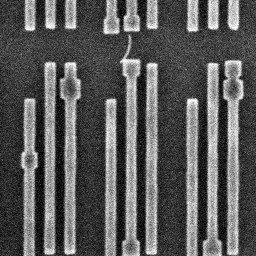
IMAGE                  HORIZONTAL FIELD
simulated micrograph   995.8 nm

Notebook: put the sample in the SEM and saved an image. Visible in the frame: wiring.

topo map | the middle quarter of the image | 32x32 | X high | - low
XXX------------XXXX--XX---------
XXX------------XXXX--XX---------
XXX------------XXXX--XX---------
XXX-------------XX---XX---------
XXXX------------XX---XX---------
XXXX------------XX---XX---------
XXXX------------XX---XX---------
XXXX------------XX---XX---------
XXX-------------XX---XX---------
-XX--------XX---XX---XX--------X
-XX--------XX---XX---XX--------X
-XX--------XX---XX---XX--------X
-XX--------XX---XX---XX--------X
-XX--------XX---XX---XX--------X
-XX--------XX---XX---XX--------X
-XX--------XX---XX---XX--------X
-XX--------XX---XX---XX--------X
-XX--------XX---XX---XX--------X
-XX--------XX---XX---XX--------X
-XX--------XX---XX---XX--------X
XXX--------XX---XX---XX--------X
XXX--------XX---XX---XX--------X
XXX--------XX---XX---XX--------X
XXX--------XX---XX---XX--------X
XXX--------XX---XX---XX--------X
XXX--------XX---XX---XX--------X
XXX--------XX---XX---XX--------X
-XX--------XX---XX---XX--------X
-XX--------XX---XX---XX--------X
-XX--------XX---XX---XX--------X
-XX--------XX---XX---XX--------X
-XX--------XX---XX---XX--------X